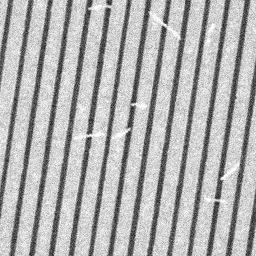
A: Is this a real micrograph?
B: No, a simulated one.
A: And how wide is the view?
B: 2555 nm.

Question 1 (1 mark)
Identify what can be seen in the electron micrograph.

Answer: parallel lines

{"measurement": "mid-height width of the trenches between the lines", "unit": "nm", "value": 59.2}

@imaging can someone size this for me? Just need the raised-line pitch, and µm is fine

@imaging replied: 0.195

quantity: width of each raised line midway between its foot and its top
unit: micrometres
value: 0.137